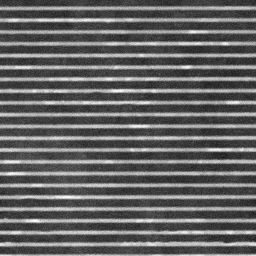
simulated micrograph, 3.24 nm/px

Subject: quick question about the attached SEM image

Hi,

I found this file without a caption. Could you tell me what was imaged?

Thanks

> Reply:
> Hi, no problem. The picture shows parallel lines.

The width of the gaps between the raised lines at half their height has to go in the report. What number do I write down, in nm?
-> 28.8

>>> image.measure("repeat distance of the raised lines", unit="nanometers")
38.2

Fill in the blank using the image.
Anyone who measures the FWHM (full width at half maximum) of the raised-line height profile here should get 9.7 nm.